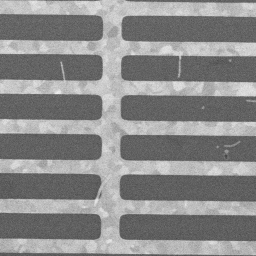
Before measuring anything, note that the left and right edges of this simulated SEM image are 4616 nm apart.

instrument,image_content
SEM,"groups of lines, slits or small figures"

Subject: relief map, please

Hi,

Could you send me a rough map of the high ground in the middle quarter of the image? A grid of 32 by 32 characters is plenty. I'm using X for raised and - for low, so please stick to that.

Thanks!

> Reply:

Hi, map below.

----------XXXX------------------
----------XXXX------------------
----------XXXX------------------
----------XXXX------------------
XXXXXXXXXXXXXXXXXXXXXXXXXXXXX---
XXXXXXXXXXXXXXXXXXXXXXXXXXXXXXXX
XXXXXXXXXXXXXXXXXXXXXXXXXXXXXXXX
--------XXXXXXXXXXXXXXXXXXXXXXXX
---------XXXXX------------------
----------XXXX------------------
----------XXXX------------------
----------XXXX------------------
----------XXXX------------------
---------XXXXX------------------
XXXXXXXXXXXXXXXXXXXX------------
XXXXXXXXXXXXXXXXXXXXXXXXXXXXXXXX
XXXXXXXXXXXXXXXXXXXXXXXXXXXXXXXX
--------XXXXXXXX-------------XXX
---------XXXXX------------------
----------XXXX------------------
----------XXXX------------------
----------XXXX------------------
----------XXXX------------------
---------XXXXX------------------
XXXXXXXXXXXXXXXXXXXXXXXXXXXXXX--
XXXXXXXXXXXXXXXXXXXXXXXXXXXXXXXX
XXXXXXXXXXXXXXXXXXXXXXXXXXXXXXXX
--------XXXXXXX--------------XXX
---------XXXXX------------------
----------XXXX------------------
---------XXXXX------------------
---------XXXXX------------------